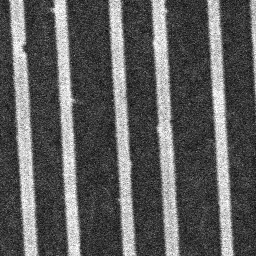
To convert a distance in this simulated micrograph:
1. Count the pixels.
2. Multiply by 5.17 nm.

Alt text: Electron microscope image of parallel lines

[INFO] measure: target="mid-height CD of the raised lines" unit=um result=0.0574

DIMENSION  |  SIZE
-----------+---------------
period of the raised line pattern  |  254 nm